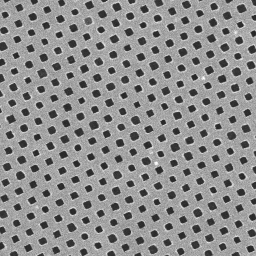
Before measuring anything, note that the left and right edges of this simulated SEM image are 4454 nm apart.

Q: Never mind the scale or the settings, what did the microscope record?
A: a regular array of holes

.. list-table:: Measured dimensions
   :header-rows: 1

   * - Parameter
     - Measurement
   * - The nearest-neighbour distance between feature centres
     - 0.274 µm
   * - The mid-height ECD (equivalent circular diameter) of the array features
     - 137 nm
